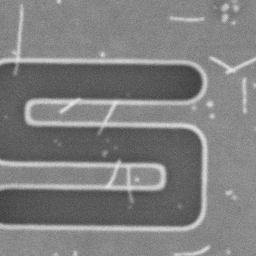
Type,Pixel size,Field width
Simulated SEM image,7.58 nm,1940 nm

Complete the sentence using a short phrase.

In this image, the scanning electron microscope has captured groups of lines, slits or small figures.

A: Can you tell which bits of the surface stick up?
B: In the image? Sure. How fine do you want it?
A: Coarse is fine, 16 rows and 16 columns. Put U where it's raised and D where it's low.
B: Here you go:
UUUUUUUUUUUUUUUU
UUUUUUUUUUUUUUUU
UUUUUUUUUUUUUUUU
UUUUUUUUUUUUUUUU
DDDDDDDDDDDDDUUU
DDDDDDDDDDDDDUUU
DDUUUUUUUUUUUUUU
DDUUUUUUUUUUUUUU
DDDDDDDDDDDDUUUU
DDDDDDDDDDDDDUUU
UUUUUUUUUUDDDUUU
UUUUUUUUUUDDDUUU
DDDDDDDDDDDDDUUU
DDDDDDDDDDDDDUUU
UUUUUUUUUUUUUUUU
UUUUUUUUUUUUUUUU